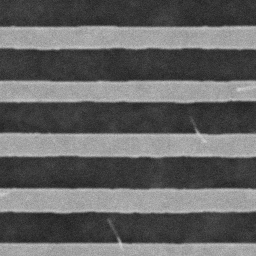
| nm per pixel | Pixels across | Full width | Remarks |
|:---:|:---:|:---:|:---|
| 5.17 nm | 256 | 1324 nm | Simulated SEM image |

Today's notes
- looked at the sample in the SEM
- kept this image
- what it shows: lines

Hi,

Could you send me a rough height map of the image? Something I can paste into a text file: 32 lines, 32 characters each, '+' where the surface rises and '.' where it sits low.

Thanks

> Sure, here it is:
................................
................................
................................
++++++++++++++++++++++++++++++++
++++++++++++++++++++++++++++++++
++++++++++++++++++++++++++++++++
................................
................................
................................
................................
++++++++++++++++++++++++++++++++
++++++++++++++++++++++++++++++++
++++++++++++++++++++++++++++++++
................................
................................
................................
................................
++++++++++++++++++++++++++++++++
++++++++++++++++++++++++++++++++
+.++++...+++++++++++++++++++++++
................................
................................
................................
................................
++++++++++++++++++++++++++++++++
++++++++++++++++++++++++++++++++
.......++......++++++++.........
................................
................................
................................
++++++++++++++++.......+++++++++
++++++++++++++++++++++++++++++++